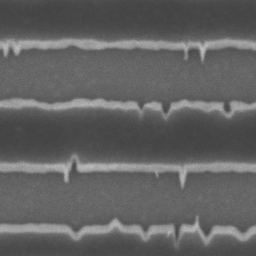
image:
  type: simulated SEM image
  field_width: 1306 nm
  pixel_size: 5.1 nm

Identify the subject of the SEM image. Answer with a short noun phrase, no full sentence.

one or a few lines or trenches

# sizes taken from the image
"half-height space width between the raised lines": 60.3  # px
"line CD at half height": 322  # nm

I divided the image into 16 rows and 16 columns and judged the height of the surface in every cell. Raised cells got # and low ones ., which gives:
################
################
################
................
................
................
##...##....#....
################
################
################
.###.#....####.#
................
................
................
####.##########.
################